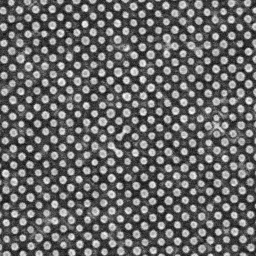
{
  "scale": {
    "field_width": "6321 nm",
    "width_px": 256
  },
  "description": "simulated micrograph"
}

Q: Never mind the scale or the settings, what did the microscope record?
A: a regular array of raised bodies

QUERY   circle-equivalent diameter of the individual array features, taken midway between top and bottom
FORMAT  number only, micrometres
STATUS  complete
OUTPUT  0.147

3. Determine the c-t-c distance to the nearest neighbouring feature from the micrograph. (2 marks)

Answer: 278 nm